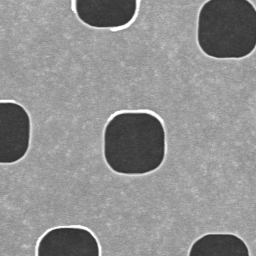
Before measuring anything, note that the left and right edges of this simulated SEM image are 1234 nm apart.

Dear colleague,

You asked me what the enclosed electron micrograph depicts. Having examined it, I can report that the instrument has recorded holes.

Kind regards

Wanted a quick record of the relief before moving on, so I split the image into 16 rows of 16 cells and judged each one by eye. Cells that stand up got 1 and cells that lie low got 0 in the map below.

1111100011111000
1111110011110000
1111111111110000
1111111111111001
1111111111111111
1111111111111111
0111111111111111
0011111000111111
0011111000111111
0011111000111111
1111111000111111
1111111111111111
1111111111111111
1111111111111111
1110011111111111
1100001111110001